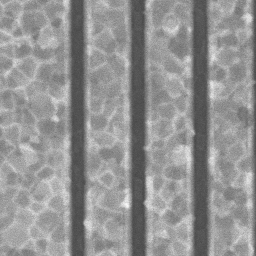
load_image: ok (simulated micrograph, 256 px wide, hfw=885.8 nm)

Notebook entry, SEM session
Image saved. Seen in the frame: one or a few lines or trenches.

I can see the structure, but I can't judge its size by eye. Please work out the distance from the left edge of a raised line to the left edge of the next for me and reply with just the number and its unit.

0.212 microns